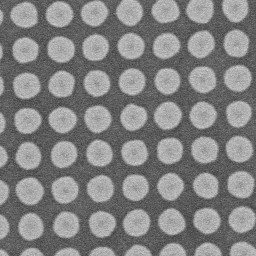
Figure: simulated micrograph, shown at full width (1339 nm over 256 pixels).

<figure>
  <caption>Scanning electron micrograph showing an array of small figures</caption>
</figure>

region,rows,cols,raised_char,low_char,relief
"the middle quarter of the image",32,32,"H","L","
LLLLLLLLLLLLLLLLLLLLLLLLLLLLLLLL
LLLLLLLLLLLLLLLHHHLLLLLLHHHHLLLL
HLLLLLHHHHLLLLHHHHHHLLLHHHHHHLLH
HHLLLHHHHHHLLLHHHHHHLLLHHHHHHLLH
HHHLLHHHHHHLLLHHHHHHLLLHHHHHHLLH
HHLLLHHHHHHLLLHHHHHHLLLHHHHHHLLL
HHLLLHHHHHHLLLHHHHHHLLLHHHHHLLLL
HHLLLLLHHHLLLLLLHHLLLLLLLHLLLLLL
LLLLLLLLLLLLLLLLLLLLLLLLLLLLLLLL
LLLLLLLLLLLLLLLLLLLLLLLLLLLLLLLL
LLLLLLLLHLLLLLLLHHLLLLLLHHHHLLLL
HHLLLLHHHHHLLLLHHHHHLLLHHHHHHLLL
HHHLLHHHHHHLLLHHHHHHHLLHHHHHHLLH
HHHLLHHHHHHHLLHHHHHHHLLHHHHHHLLH
HHHLLHHHHHHHLLHHHHHHLLLHHHHHHLLL
HHHLLLHHHHHLLLLHHHHHLLLLHHHHLLLL
HHLLLLLHHHLLLLLLHHLLLLLLLLLLLLLL
LLLLLLLLLLLLLLLLLLLLLLLLLLLLLLLL
LLLLLLLLLLLLLLLLLLLLLLLLLLLLLLLL
HLLLLLLHHHLLLLLLHHHHLLLLHHHHHLLL
HHHLLLHHHHHLLLLHHHHHLLLHHHHHHLLL
HHHLLLHHHHHHLLHHHHHHHLLHHHHHHHLL
HHHLLLHHHHHHLLHHHHHHHLLHHHHHHHLL
HHHLLLHHHHHHLLLHHHHHHLLLHHHHHLLL
HHLLLLHHHHHLLLLHHHHHLLLLLHHHLLLL
HLLLLLLLLLLLLLLLLLLLLLLLLLLLLLLL
LLLLLLLLLLLLLLLLLLLLLLLLLLLLLLLL
LLLLLLLLLLLLLLLLLLLLLLLLLHHHLLLL
HHLLLLLHHHHLLLLHHHHHLLLLHHHHHLLL
HHHLLLHHHHHHLLLHHHHHHLLLHHHHHHLL
HHHLLLHHHHHHLLLHHHHHHLLHHHHHHHLL
HHHHLLHHHHHHLLLHHHHHHLLLHHHHHHLL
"